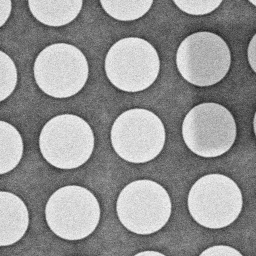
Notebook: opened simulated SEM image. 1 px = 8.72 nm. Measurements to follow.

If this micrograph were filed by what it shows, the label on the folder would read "an array of small figures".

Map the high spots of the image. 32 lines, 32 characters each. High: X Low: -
X---XXXXXX---XXXXXX---XXXXX-----
X---XXXXXX---XXXXX-----XXX------
X----XXXX------X----------------
--------------------------------
------------------------XXX-----
-------X------XXXXX----XXXXX---X
-----XXXXX----XXXXX---XXXXXXX--X
X----XXXXXX--XXXXXXX--XXXXXXX--X
XX--XXXXXXX--XXXXXXX--XXXXXXX---
XX--XXXXXXX--XXXXXXX---XXXXX----
XX---XXXXX----XXXXX-----XXX-----
X-----XXXX----------------------
--------------------------------
------------------------XXXX----
-------XX------XXXXX---XXXXXX---
X-----XXXXX---XXXXXX---XXXXXX---
XX---XXXXXX---XXXXXXX--XXXXXX---
XXX--XXXXXXX--XXXXXXX--XXXXXX---
XXX--XXXXXXX--XXXXXX----XXXXX---
XXX--XXXXXX----XXXX------XX-----
XX-----XXX----------------------
X-------------------------------
-------------------------XXXX---
--------XX------XXXX----XXXXXX--
XX----XXXXXX---XXXXXX---XXXXXX--
XXX---XXXXXX---XXXXXX---XXXXXX--
XXX---XXXXXX---XXXXXX---XXXXXX--
XXX---XXXXXX---XXXXXX---XXXXX---
XXX---XXXXXX----XXXX------------
XXX----XXXX---------------------
X-------------------------------
------------------X------XXXXX--